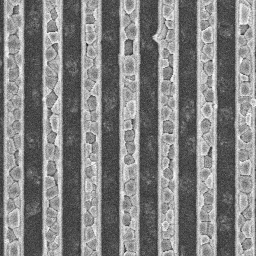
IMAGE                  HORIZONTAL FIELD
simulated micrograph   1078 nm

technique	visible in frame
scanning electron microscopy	parallel lines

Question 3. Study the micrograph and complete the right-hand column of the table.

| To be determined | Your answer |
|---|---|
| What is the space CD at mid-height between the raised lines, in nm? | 85.9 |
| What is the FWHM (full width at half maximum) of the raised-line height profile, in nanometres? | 74.8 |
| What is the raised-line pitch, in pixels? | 38.6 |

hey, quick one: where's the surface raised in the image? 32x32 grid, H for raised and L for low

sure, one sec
LHHLLHHHLLHHHLLHHLLLHHLLLHHLLLHH
LHHLLLHHLLHHHLLHHLLLHHLLLHHLLLHH
LHHLLLHHLLHHHLLHHLLLHHLLLHHLLLHH
LHHLLLHHLLHHHLLHHLLLHHLLLHHLLLHH
LHHLLLHHLLHHHLLHHLLHHHLLLHHLLLHH
LHHLLLHHLLHHHLLHHLLLHHLLLHHLLLHH
LHHLLLHHLLHHHLLHHLLLHHLLLHHLLLHH
LHHLLLHHLLHHHLLHHLLLHHLLLHHLLLHH
LHHLLLHHLLHHLLLHHLLLHHLLLHHLLLHH
LHHLLHHHLLHHLLLHHLLLHHLLLHHLLLHH
LHHLLLHHLLHHLLLHHLLLHHLLLHHLLLHH
LHHLLLHHLLHHLLLHHLLLHHLLLHHLLLHH
LHHLLHHHLLHHLLLHHLLLHHLLLHHLLLHH
LHHLLLHHLLHHLLLHHLLLHHLLLHHLLLHH
LHHLLLHHLLHHLLLHHLLLHHLLLHHLLLHH
LHHLLLHHLLHHLLLHHLLLHHLLLHHLLLHH
LHHLLLHHLLHHLLLHHLLLHHLLLHHLLLHH
LHHLLLHHLLHHLLLHHLLLHHLLLHHLLLHH
LHHLLLHHLLHHLLLHHLLLHHLLLHHLLLHH
LHHLLLHHLLHHLLLHHLLLHHLLLHHLLLHH
LHHLLLHHLLHHLLLHHLLLHHLLLHHLLLHH
LHHLLLHHLLHHLLLHHLLLHHLLLHHLLLHH
LHHLLLHHLLHHLLLHHLLLHHLLLHHLLLHH
LHHLLLHHLLHHLLLHHLLLHHLLLHHLLLHH
LHHLLLHHLLHHLLLHHLLLHHLLLHHLLLHH
LHHLLLHHLLHHLLLHHLLLHHLLLHHLLLHH
LHHLLLHHLLHHLLLHHLLLHHLLLHHLLLHH
LHHLLLHHLLHHLLLHHLLLHHLLLHHLLLHH
LHHLLHHHLLHHLLLHHLLLHHLLLHHLLLHH
LHHLLHHHLLHHLLLHHLLLHHLLLHHLLLHH
LHHLLLHHLLHHLLLHHLLLHHLLLHHLLLHH
LHHLLHHHLLHHLLLHHLLLHHLLLHHLLLHH